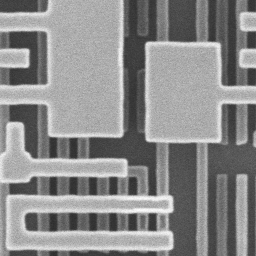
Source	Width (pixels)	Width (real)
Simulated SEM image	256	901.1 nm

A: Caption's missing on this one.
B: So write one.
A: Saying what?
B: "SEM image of wiring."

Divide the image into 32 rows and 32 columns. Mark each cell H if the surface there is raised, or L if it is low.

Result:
LLLLLLHHHHHHHHHLLLLLLLLLLLLLLLLL
LLLLLHHHHHHHHHHLLLLLLLLLLLLLLLLL
HHHHHHHHHHHHHHHLLLLLLLLLLLLLLLHH
HHHHHHHHHHHHHHHLLLLLLLLLLLLLLLHH
LLLLLLHHHHHHHHHLLLLLLLLLLLLLLLLL
LLLLLLHHHHHHHHHLLLHHHHHHHHHLLLLL
HHHHLLHHHHHHHHHLLLHHHHHHHHHHLLHH
HHHHLLHHHHHHHHHLLLHHHHHHHHHHLLHH
LLLLLLHHHHHHHHHLLLHHHHHHHHHHLLLL
LLLLLLHHHHHHHHHLLLHHHHHHHHHHLLLL
LLLLLLHHHHHHHHHLLLHHHHHHHHHHLLLL
HHHHHHHHHHHHHHHLLLHHHHHHHHHHHHHH
HHHHHHHHHHHHHHHLLLHHHHHHHHHHHHHH
LLLLLLHHHHHHHHHLLLHHHHHHHHHHLLLL
LLLLLLHHHHHHHHHLLLHHHHHHHHHHLLLL
LHHLLLHHHHHHHHHLLLHHHHHHHHHHLLLL
LHHLLLHHHHHHHHHLLLHHHHHHHHHHLLLL
LHHLLLLLLLLLLLLLLLHHHHHHHHHHLLLL
LHHLLLLLLLLLLLLLLLLLLLLLLLLLLLLL
HHHHLLLLLLLLLLLLLLLLLLLLLLLLLLLL
HHHHHHHHHHHHHHHHLLLLLLLLLLLLLLLL
HHHHHHHHHHHHHHHHLLLLLLLLLLLLLLLL
HHHHLLLLLLLLLLLLLLLLLLLLLLLLLLLL
LLLLLLLLLLLLLLLLLLLLLLLLLLLLLLLL
LHHHHLLLHHLLLLLLLLLLLLLLLLLLLLLL
LHHHHHHHHHHHHHHHHHHHHHLLLLLLLLLL
LHHHHHHHHHHHHHHHHHHHHLLLLLLLLLLL
LHHLLLLLLLLLLLLLLLLLLLLLLLLLLLLL
LHHLLLLLLLLLLLLLLLLLLLLLLLLLLLLL
LHHHHHHHHHHHHHHHHHHHHHLLLLLLLLLL
LHHHHHHHHHHHHHHHHHHHHHLLLLLLLLLL
LLLLLLLLLLLLLLLLLLLLLLLLLLLLLLLL